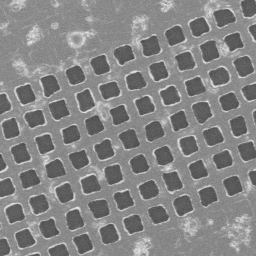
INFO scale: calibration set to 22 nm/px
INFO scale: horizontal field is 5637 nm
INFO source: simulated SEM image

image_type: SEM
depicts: a regular array of holes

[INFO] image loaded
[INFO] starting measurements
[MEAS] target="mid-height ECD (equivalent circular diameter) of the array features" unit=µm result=0.427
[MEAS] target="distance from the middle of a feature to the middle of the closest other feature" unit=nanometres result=570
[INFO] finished